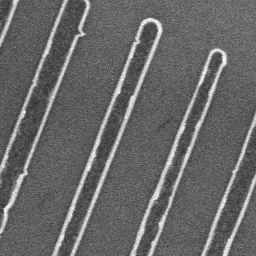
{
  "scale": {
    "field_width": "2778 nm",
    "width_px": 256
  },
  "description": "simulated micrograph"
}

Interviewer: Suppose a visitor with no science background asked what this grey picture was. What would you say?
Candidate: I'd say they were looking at one or a few lines or trenches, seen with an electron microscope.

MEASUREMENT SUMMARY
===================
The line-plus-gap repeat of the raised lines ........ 800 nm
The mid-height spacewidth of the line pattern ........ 591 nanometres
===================